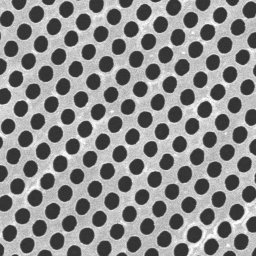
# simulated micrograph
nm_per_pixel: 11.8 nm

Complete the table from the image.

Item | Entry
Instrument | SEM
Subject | a regular array of holes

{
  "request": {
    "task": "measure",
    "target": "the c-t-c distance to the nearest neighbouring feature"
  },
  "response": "248 nm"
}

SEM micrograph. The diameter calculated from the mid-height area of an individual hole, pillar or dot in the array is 15.7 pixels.